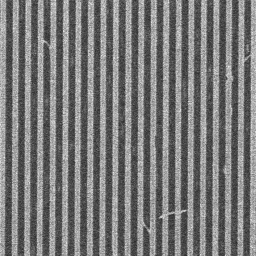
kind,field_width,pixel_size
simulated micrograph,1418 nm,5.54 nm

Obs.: parallel lines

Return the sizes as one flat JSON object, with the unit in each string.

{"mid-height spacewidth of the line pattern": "40.8 nm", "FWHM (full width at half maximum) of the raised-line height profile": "30.4 nanometres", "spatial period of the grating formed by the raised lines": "69.4 nanometers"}